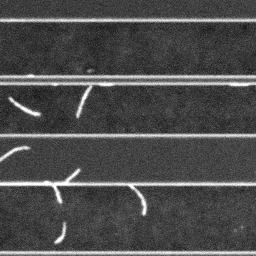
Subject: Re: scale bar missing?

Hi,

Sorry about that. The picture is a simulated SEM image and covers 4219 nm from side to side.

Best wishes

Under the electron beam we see lines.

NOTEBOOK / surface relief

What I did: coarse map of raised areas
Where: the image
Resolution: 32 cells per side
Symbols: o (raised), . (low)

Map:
oooooooooooooooooooooooooooooooo
oooooooooooooooooooooooooooooooo
oooooooooooooooooooooooooooooooo
................................
................................
................................
................................
................................
................................
................................
............oo...............oo.
................................
................................
................................
................................
................................
................................
oooooooooooooooooooooooooooooooo
oooooooooooooooooooooooooooooooo
oooooooooooooooooooooooooooooooo
oooooooooooooooooooooooooooooooo
oooooooooooooooooooooooooooooooo
oooooooooooooooooooooooooooooooo
................................
................................
................................
................................
................................
................................
................................
................................
................................